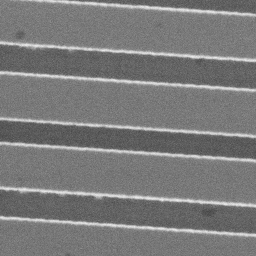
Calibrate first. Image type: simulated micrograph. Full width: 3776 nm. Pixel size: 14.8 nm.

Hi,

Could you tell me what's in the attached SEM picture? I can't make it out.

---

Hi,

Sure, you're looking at lines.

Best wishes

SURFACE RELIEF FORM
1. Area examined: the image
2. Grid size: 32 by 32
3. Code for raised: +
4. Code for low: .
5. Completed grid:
+++++++++++++...................
++++++++++++++++++++++++++++....
++++++++++++++++++++++++++++++++
++++++++++++++++++++++++++++++++
++++++++++++++++++++++++++++++++
.+++++++++++++++++++++++++++++++
................++++++++++++++++
.............................+++
................................
++++++++........................
+++++++++++++++++++++...........
++++++++++++++++++++++++++++++++
++++++++++++++++++++++++++++++++
++++++++++++++++++++++++++++++++
++++++++++++++++++++++++++++++++
........++++++++++++++++++++++++
.......................+++++++++
................................
++++++++++......................
+++++++++++++++++++++++++.......
++++++++++++++++++++++++++++++++
++++++++++++++++++++++++++++++++
++++++++++++++++++++++++++++++++
++++++++++++++++++++++++++++++++
.............+++++++++++++++++++
............................++++
................................
++++++..........................
+++++++++++++++++++.............
++++++++++++++++++++++++++++++++
++++++++++++++++++++++++++++++++
++++++++++++++++++++++++++++++++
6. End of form